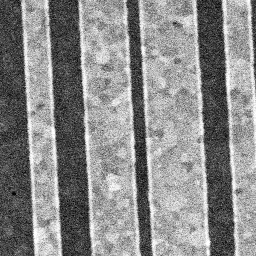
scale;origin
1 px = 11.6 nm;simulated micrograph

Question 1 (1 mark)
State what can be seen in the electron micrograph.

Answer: one or a few lines or trenches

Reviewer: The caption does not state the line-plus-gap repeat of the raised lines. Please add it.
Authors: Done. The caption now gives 773 nanometers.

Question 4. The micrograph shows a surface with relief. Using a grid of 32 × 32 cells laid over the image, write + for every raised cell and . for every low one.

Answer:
...+++....++++++..++++++....+++.
...+++....++++++..++++++....+++.
...+++....++++++..++++++....+++.
...+++....++++++..+++++++...+++.
...+++....++++++..++++++....+++.
...+++....++++++..+++++++...+++.
...+++....++++++..+++++++...+++.
...+++....++++++..+++++++...+++.
...+++....++++++..+++++++....++.
...+++....++++++..+++++++...++++
...+++.....+++++..+++++++...++++
....++.....+++++..+++++++....+++
....++.....+++++..+++++++....+++
....++.....+++++..+++++++....+++
....+++....+++++..+++++++....+++
....+++....+++++..+++++++....+++
....+++....+++++..+++++++....+++
....+++....++++++..++++++....+++
....+++....++++++..++++++....+++
....+++....++++++..++++++....+++
....+++....++++++..++++++....+++
....+++....++++++..++++++....+++
....+++....++++++..+++++++...+++
....+++....++++++..+++++++...+++
....+++....++++++..+++++++...+++
....+++....++++++..+++++++...+++
....+++....++++++..+++++++...+++
....+++....++++++..+++++++...+++
....+++....++++++..+++++++....++
....+++.....+++++..+++++++...+++
.....++.....+++++..+++++++....++
.....+++....+++++..+++++++....++